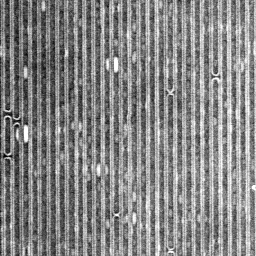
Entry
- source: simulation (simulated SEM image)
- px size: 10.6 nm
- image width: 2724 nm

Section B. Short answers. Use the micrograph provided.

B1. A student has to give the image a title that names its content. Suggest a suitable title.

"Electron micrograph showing parallel lines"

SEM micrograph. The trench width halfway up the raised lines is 63.9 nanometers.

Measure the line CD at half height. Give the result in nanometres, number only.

29.3